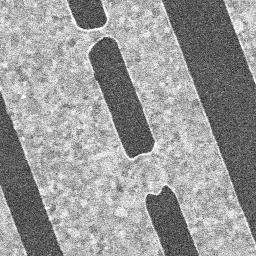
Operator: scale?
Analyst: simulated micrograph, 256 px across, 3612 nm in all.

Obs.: one or a few lines or trenches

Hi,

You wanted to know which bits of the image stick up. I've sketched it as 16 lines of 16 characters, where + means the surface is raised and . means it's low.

++++...+++....++
+++++..++++....+
++++++.++++....+
++++++..+++....+
++++++..++++....
++++++..++++....
+++++++..++++...
.++++++..++++...
.++++++...+++...
..++++++.+++++..
..++++++++++++..
..++++++++++++..
...++++++..++++.
+..++++++...+++.
+..+++++++..++++
+...++++++..++++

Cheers